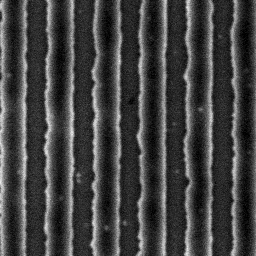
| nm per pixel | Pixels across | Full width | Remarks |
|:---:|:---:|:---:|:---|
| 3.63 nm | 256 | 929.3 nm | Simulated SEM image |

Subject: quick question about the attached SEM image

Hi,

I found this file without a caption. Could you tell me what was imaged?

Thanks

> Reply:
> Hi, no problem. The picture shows lines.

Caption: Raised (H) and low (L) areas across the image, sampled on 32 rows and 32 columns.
HHHLLLHHHLLLHHHLLLHHHLLHHHLLLHHH
HHHLLLHHHLLLHHHLLLHHHLLHHHHLLHHH
HHHLLLHHHLLLHHHLLLHHHLLHHHLLLHHH
HHHLLLHHHLLLHHHLLHHHHLLHHHHLLHHH
HHHLLLHHHLLLHHHLLHHHHLLHHHLLLHHH
HHHLLLHHHLLLHHHLLHHHHLLHHHLLLHHH
HHHLLLHHHLLLHHHLLLHHHLLLHHLLLHHH
HHHLLLHHHLLLHHHLLHHHHLLLHHLLLHHH
HHHLLLHHHLLLHHHLLHHHHLLHHHLLLHHH
HHHLLLHHHLLLHHHLLHHHHLLHHHLLLHHH
HHHLLLHHHLLLHHHLLLHHHLLHHHLLLHHH
HHHLLLHHHLLLHHHLLLHHHLLHHHLLLHHH
HHHLLLHHHLLLHHHLLHHHHLLHHHLLLHHH
HHHLLLHHHLLLHHHLLHHHHLLHHHLLLHHH
HHHLLLHHHLLLHHHLLHHHHLLHHHLLLHHH
HHHLLLHHHLLLHHHLLLHHHLLHHHLLLHHH
HHHLLLHHHLLLHHHLLHHHHLLHHHLLLHHH
HHHLLLHHHLLLHHHLLHHHHLLHHHLLLHHH
HHHLLLHHHLLLHHHLLLHHHLLHHHLLLHHH
HHHLLLHHHLLLHHHLLLHHHLLHHHLLLHHH
HHHLLLHHHLLLHHHLLLHHHLLHHHLLLHHH
HHHLLLHHHLLLHHHLLLHHHLLHHHLLLHHH
HHHLLLHHHLLLHHHLLLHHHLLLHHLLLHHH
HHHLLLHHHLLLHHHLLLHHHLLHHHLLLHHH
HHHLLLHHHLLLHHHLLLHHHLLHHHLLLHHH
HHHLLLHHHLLLHHHLLHHHHLLHHHLLLHHH
HHHLLLHHHLLLHHHLLHHHHLLHHHLLLHHH
HHHLLLHHHLLLHHHLLHHHHLLHHHLLLHHH
HHHLLLHHHLLLHHHLLHHHHLLHHHLLLHHH
HHHLLLHHHLLLHHHLLHHHHLLHHHLLLHHH
HHHLLLHHHLLHHHHLLHHHHLLHHHLLLHHH
HHHLLLHHHLLLHHHLLHHHHLLHHHLLLHHH